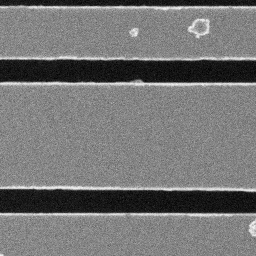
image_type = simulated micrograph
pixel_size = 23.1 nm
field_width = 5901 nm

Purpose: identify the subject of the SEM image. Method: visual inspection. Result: lines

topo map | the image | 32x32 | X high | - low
--------------------------------
XXXXXXXXXXXXXXXXXXXXXXXXXXXXXXXX
XXXXXXXXXXXXXXXXXXXXXXXXXXXXXXXX
XXXXXXXXXXXXXXXXXXXXXXXXXXXXXXXX
XXXXXXXXXXXXXXXXXXXXXXXXXXXXXXXX
XXXXXXXXXXXXXXXXXXXXXXXXXXXXXXXX
XXXXXXXXXXXXXXXXXXXXXXXXXXXXXXXX
--------------------------------
--------------------------------
--------------------------------
XXXXXXXXXXXXXXXXXXXXXXXXXXXXXXXX
XXXXXXXXXXXXXXXXXXXXXXXXXXXXXXXX
XXXXXXXXXXXXXXXXXXXXXXXXXXXXXXXX
XXXXXXXXXXXXXXXXXXXXXXXXXXXXXXXX
XXXXXXXXXXXXXXXXXXXXXXXXXXXXXXXX
XXXXXXXXXXXXXXXXXXXXXXXXXXXXXXXX
XXXXXXXXXXXXXXXXXXXXXXXXXXXXXXXX
XXXXXXXXXXXXXXXXXXXXXXXXXXXXXXXX
XXXXXXXXXXXXXXXXXXXXXXXXXXXXXXXX
XXXXXXXXXXXXXXXXXXXXXXXXXXXXXXXX
XXXXXXXXXXXXXXXXXXXXXXXXXXXXXXXX
XXXXXXXXXXXXXXXXXXXXXXXXXXXXXXXX
XXXXXXXXXXXXXXXXXXXXXXXXXXXXXXXX
XXXXXXXXXXXXXXXXXXXXXXXXXXXXXXXX
--------------------------------
--------------------------------
--------------------------------
XXXXXXXXXXXXXXXXXXXXXXXXXXXXXXXX
XXXXXXXXXXXXXXXXXXXXXXXXXXXXXXXX
XXXXXXXXXXXXXXXXXXXXXXXXXXXXXXXX
XXXXXXXXXXXXXXXXXXXXXXXXXXXXXXXX
XXXXXXXXXXXXXXXXXXXXXXXXXXXXXXXX